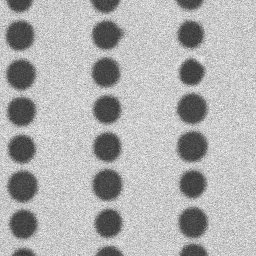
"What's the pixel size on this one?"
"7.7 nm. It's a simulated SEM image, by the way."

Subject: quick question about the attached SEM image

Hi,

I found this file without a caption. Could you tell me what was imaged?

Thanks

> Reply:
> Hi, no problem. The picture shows a regular array of holes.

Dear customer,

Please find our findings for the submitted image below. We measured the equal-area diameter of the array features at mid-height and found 223 nm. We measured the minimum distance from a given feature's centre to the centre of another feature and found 287 nanometres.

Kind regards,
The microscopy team